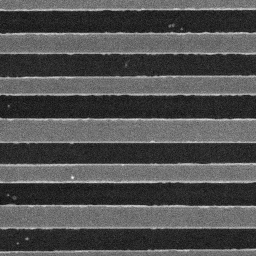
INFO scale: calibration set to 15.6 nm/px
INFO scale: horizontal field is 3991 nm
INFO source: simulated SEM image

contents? lines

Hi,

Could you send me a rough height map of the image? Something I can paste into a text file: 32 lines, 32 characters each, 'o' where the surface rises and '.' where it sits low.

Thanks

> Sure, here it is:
oooooooooooooooooooooooooooooooo
................................
................................
................................
oooooooooooooooooooooooooooooooo
oooooooooooooooooooooooooooooooo
oooooooooooooooooooooooooooooooo
................................
................................
................................
oooooooooooooooooooooooooooooooo
oooooooooooooooooooooooooooooooo
................................
................................
................................
oooooooooooooooooooooooooooooooo
oooooooooooooooooooooooooooooooo
oooooooooooooooooooooooooooooooo
................................
................................
.......................o....oooo
oooooooooooooooooooooooooooooooo
oooooooooooooooooooooooooooooooo
................................
................................
................................
oooooooooooooooooooooooooooooooo
oooooooooooooooooooooooooooooooo
...ooo..........................
................................
................................
oooooooooooooooooooooooooooooooo